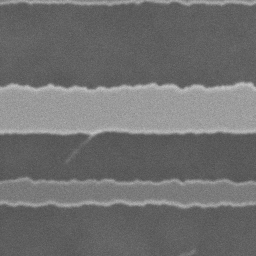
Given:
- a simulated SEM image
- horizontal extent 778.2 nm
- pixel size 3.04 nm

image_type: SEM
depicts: lines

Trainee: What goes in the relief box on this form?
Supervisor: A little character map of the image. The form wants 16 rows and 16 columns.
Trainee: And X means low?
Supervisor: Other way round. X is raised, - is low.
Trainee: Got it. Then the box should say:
----------------
----------------
----------------
----------------
----------------
XXXXX--XXXXXXXXX
XXXXXXXXXXXXXXXX
XXXXXXXXXXXXXXXX
----------------
----------------
----------------
XXXXXXXXXXXXXXXX
XXXXXXXXXXXXXXXX
----------------
----------------
----------------